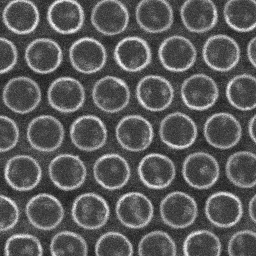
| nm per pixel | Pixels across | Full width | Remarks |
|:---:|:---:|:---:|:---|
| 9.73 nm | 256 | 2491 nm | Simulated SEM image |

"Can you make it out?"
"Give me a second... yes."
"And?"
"a regular array of raised bodies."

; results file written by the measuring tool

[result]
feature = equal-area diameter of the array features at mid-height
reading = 337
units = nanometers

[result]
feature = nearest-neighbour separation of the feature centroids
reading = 428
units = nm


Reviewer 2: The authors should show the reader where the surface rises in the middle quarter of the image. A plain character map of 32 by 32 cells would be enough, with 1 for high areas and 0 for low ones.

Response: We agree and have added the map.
00011111100000111111000001111110
00001111000000001100000000001100
00000000000000000000000000000000
00000000000100000000111100000000
11100000011111100001111111000011
11110000111111100001111111000011
11111000111111110011111111100011
11111000111111110011111111100011
11111000111111110001111111100011
11111000111111110001111111000011
11110000011111100000111111000001
11000000001111000000000000000000
00000000000000000000000000000000
00001111000000001110000000111110
00011111100000111111100001111111
00111111110000111111110001111111
00111111110001111111110011111111
00111111110001111111110011111111
00111111110001111111110001111111
00011111110000111111100001111111
00011111100000011111100000011110
00000000000000000100000000000000
00000000000000000000000000000000
11100000001111000000111110000001
11110000111111100000111111100011
11111000111111110001111111100011
11111000111111110001111111100011
11111000111111110001111111100011
11111000111111110001111111100011
11110000011111100000111111000001
11100000001111000000001110000000
00000000000000000000000000000000